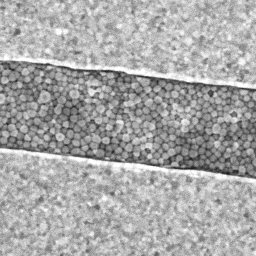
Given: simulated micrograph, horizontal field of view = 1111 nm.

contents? one or a few lines or trenches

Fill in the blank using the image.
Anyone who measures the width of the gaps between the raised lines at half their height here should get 401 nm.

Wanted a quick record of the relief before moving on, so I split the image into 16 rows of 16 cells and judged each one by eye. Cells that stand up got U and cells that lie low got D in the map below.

UUUUUUUUUUUUUUUU
UUUUUUUUUUUUUUUU
UUUUUUUUUUUUUUUU
UUUUUUUUUUUUUUUU
DDDDDDDDUUUUUUUU
DDDDDDDDDDDDDDDD
DDDDDDDDDDDDDDDD
DDDDDDDDDDDDDDDD
DDDDDDDDDDDDDDDD
UUDDDDDDDDDDDDDD
UUUUUUUUUUDDDDDD
UUUUUUUUUUUUUUUU
UUUUUUUUUUUUUUUU
UUUUUUUUUUUUUUUU
UUUUUUUUUUUUUUUU
UUUUUUUUUUUUUUUU